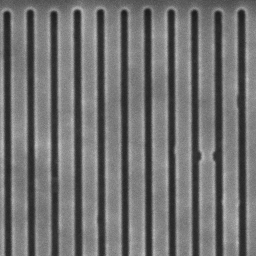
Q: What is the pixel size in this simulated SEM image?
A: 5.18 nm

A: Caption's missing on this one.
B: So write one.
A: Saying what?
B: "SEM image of parallel lines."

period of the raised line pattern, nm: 122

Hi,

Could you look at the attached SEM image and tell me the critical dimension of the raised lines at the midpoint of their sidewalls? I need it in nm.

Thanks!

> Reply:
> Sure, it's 77.8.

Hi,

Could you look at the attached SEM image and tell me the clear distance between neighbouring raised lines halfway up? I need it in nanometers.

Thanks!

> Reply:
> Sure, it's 43.4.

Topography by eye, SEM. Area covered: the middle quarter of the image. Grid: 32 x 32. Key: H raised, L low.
HHLLLHHHLLHHHHLLHHHHLLHHHHLLHHHH
HHLLLHHHLLHHHHLLHHHHLLHHHHLLHHHH
HHLLLHHHLLHHHHLLHHHHLLHHHHLLHHHH
HHLLLHHHLLHHHHLLHHHHLLHHHHLLHHHH
HHLLLHHHLLHHHHLLHHHHLLHHHHLLHHHH
HHLLLHHHLLHHHHLLHHHHLLHHHHLLHHHH
HHLLLHHHLLHHHHLLHHHHLLHHHHLLHHHH
HHLLLHHHLLHHHHLLHHHHLLHHHHLLHHHH
HHLLLHHHLLHHHHLLHHHHLLHHHHLLHHHH
HHLLLHHHLLHHHHLLHHHHLLHHHHLLHHHH
HHLLLHHHLLHHHHLLHHHHLLHHHHLLHHHH
HHLLLHHHLLHHHHLLHHHHLLHHHHLLHHHH
HHLLLHHHLLHHHHLLHHHHLLHHHHLLHHHH
HHLLLHHHLLHHHHLLHHHHLLHHHHLLHHHH
HHLLLHHHLLHHHHLLHHHHLLHHHHLLHHHH
HHLLLHHHLLHHHHLLHHHHLLHHHHLLHHHH
HHLLLHHHLLHHHHLLHHHHLLHHHHLLHHHH
HHLLLHHHLLHHHHLLHHHHLLHHHHLLHHHH
HHLLLHHHLLHHHHLLHHHHLLHHHHLLHHHH
HHLLLHHHLLHHHHLLHHHHLLHHHHLLHHHH
HHLLLHHHLLHHHHLLHHHHLLHHHHLLHHHH
HHLLLHHHLLHHHHLLHHHHLLHHHHLLHHHH
HHLLLHHHLLHHHHLLHHHHLLHHHHLLHHHH
HHLLLHHHLLHHHHLLHHHHLLHHHHLLHHHH
HHLLLHHHLLHHHHLLHHHHLLHHHHLLHHHH
HHLLLHHHLLHHHHLLHHHHLLHHHHLLHHHH
HHLLLHHHLLHHHHLLHHHHLLHHHHLLHHHH
HHLLLHHHLLHHHHLLHHHHLLHHHHLLHHHH
HHLLLHHHLLHHHHLLHHHHLLHHHHLLHHHH
HHLLLHHHLLLHHHLLHHHHLLHHHHLLHHHH
HHLLLHHHLLLHHHLLHHHHLLHHHHLLHHHH
HHLLLHHHLLLHHHLLHHHHLLHHHHLLHHHH